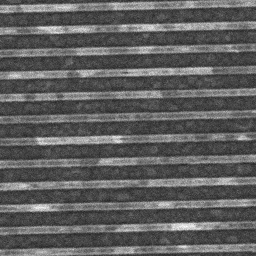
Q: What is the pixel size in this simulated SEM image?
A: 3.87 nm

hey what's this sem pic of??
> parallel lines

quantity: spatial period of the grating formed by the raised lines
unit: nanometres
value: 85.9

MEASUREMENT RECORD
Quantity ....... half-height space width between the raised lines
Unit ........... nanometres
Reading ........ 62.9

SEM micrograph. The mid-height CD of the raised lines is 0.0232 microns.